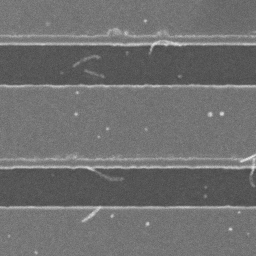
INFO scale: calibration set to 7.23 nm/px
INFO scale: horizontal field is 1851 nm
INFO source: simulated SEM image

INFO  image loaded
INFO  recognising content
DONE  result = lines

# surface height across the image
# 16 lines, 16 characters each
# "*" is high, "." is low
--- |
****************
****************
****************
................
................
****************
****************
****************
****************
****************
.....*..........
................
................
****************
****************
****************